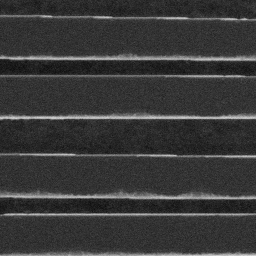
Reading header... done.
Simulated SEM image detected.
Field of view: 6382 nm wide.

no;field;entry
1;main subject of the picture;lines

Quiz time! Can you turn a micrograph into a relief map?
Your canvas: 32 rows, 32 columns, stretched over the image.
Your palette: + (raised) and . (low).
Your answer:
................................
................................
+++++++++++++++++++++++++++++++.
++++++++++++++++++++++++++++++++
++++++++++++++++++++++++++++++++
++++++++++++++++++++++++++++++++
++++++++++++++++++++++++++++++++
................................
................................
................................
++++++++++++++++++++++++++++++++
++++++++++++++++++++++++++++++++
++++++++++++++++++++++++++++++++
++++++++++++++++++++++++++++++++
++++++++++++++++++++++++++++++++
................................
................................
................................
................................
++++++++++++++++++++++..........
++++++++++++++++++++++++++++++++
++++++++++++++++++++++++++++++++
++++++++++++++++++++++++++++++++
++++++++++++++++++++++++++++++++
.+++++++++++++++++++++++++++++++
................................
................................
++++++++++++++++++++++++++++++++
++++++++++++++++++++++++++++++++
++++++++++++++++++++++++++++++++
++++++++++++++++++++++++++++++++
++++++++++++++++++++++++++++++++